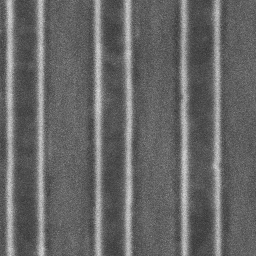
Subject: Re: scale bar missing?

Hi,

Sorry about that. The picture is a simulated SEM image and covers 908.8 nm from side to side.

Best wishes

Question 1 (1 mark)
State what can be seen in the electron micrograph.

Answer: one or a few lines or trenches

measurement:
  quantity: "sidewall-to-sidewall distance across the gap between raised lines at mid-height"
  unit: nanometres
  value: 196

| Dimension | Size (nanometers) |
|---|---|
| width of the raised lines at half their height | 116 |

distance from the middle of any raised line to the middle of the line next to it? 312 nanometers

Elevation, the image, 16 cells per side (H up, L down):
LHHLLLHHLLLHHHLL
LHHLLLHHLLLHHHLL
LHHLLLHHLLLHHHLL
LHHLLLHHLLLHHHLL
LHHLLLHHLLLHHHLL
LHHLLLHHLLLHHHLL
LHHLLLHHLLLHHHLL
LHHLLLHHLLLHHHLL
LHHLLLHHLLLLHHLL
LHHLLLHHLLLLHHLL
LHHLLLHHLLLLHHLL
LHHLLLHHLLLLHHLL
LHHLLLHHLLLLHHLL
LHHLLLHHLLLLHHLL
LHHLLLHHLLLLHHLL
LHHLLLHHLLLLHHLL